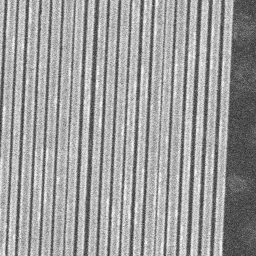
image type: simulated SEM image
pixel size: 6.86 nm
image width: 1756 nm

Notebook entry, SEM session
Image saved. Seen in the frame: parallel lines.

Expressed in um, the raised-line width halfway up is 0.0531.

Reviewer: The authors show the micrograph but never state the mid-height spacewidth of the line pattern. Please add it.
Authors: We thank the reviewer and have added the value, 24 nanometres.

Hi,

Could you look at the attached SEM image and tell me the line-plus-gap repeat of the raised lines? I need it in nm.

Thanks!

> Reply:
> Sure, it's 78.4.